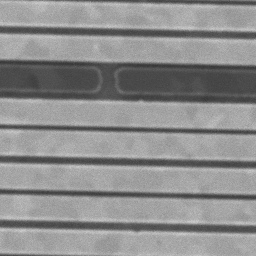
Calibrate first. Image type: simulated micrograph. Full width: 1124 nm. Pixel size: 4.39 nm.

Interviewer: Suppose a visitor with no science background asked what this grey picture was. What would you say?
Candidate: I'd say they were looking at parallel lines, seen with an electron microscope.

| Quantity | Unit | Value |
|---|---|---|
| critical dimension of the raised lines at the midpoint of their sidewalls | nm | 107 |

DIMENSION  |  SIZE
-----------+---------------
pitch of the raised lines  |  32.4 px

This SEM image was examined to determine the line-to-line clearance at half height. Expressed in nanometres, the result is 37.3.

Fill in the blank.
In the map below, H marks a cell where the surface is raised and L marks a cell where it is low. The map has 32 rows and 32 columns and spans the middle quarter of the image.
LLLLLLLLLLLLLLLLLLLLLLLLLLLLLLLL
HHHHHHHHHLLLLLHHHHHHHHHHHHHHHHHL
HHHHHHHHHLLLLHHHHHHHHHHHHHHHHHHH
HHHHHHHHHLLLLHHHHHHHHHHHHHHHHHHH
HHHHHHHHHLLLLHHHHHHHHHHHHHHHHHHH
HHHHHHHHHLLLLHHHHHHHHHHHHHHHHHHH
HHHHHHHHLLLLLLHHHHHHHHHHHHHHHHHH
LLLLLLLLLLLLLLLLLLLLLLLLLLLHHLLH
LLLLLLLLLLLLLLLLLLLLLLLLLLLLLLLL
HHHHHHHHHHHHLLLLLLLHLLLLLLLLLLLL
HHHHHHHHHHHHHHHHHHHHHHHHHHHHHHHH
HHHHHHHHHHHHHHHHHHHHHHHHHHHHHHHH
HHHHHHHHHHHHHHHHHHHHHHHHHHHHHHHH
HHHHHHHHHHHHHHHHHHHHHHHHHHHHHHHH
HHHHHHHHHHHHHHHHHHHHHHHHHHHHHHHH
LLLLLLLLLLLLLLLLLLHHHHHHHHHHHHHH
LLLLLLLLLLLLLLLLLLLLLLLLLLLLLLLL
HHHHHHHHHHHHHHHHHHHHHHHLLLLLLLLL
HHHHHHHHHHHHHHHHHHHHHHHHHHHHHHHH
HHHHHHHHHHHHHHHHHHHHHHHHHHHHHHHH
HHHHHHHHHHHHHHHHHHHHHHHHHHHHHHHH
HHHHHHHHHHHHHHHHHHHHHHHHHHHHHHHH
HHHHHHHHHHHHHHHHHHHHHHHHHHHHHHHH
LLLLLLLLLLLLLLLLLLLLLLLLLLLLLHHH
LLLLLLLLLLLLLLLLLLLLLLLLLLLLLLLL
HHHHLLLLLLLLLLLLLLLLLLLLLLLLLLLL
HHHHHHHHHHHHHHHHHHHHHHHHHHHHHHHH
HHHHHHHHHHHHHHHHHHHHHHHHHHHHHHHH
HHHHHHHHHHHHHHHHHHHHHHHHHHHHHHHH
HHHHHHHHHHHHHHHHHHHHHHHHHHHHHHHH
HHHHHHHHHHHHHHHHHHHHHHHHHHHHHHHH
LLLLLLLLLLHHHHHHHHHHHHHHHHHHHHHH